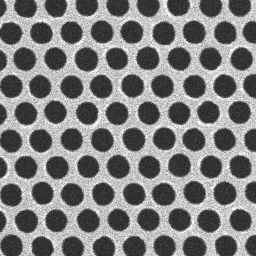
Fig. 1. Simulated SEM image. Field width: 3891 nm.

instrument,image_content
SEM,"a regular array of holes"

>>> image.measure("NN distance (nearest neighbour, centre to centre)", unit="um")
0.452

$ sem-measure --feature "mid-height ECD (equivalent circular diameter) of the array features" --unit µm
0.358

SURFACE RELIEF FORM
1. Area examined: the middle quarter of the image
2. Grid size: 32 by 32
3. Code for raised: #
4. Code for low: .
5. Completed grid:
###.....###.....###....####....#
####...######.######..######..##
################..##############
....###....####....###.....####.
.....##.....##......##.....###..
.....#......##......#.......##..
.....##.....##......##......##..
.....##.....###.....##.....###..
#..#####...#####..######..######
#####.######..######..######..##
####....###....####....###.....#
.##.....##......##......##......
.##......#......##......##......
###......##.....###.....##......
####....###....#####...####....#
################################
....####...####....####....####.
.....##.....###.....##......##..
.....##.....##.......#......#...
.....##.....###.....##......#...
....###.....###.....###.....##..
#...####...#####...#####..#####.
############################..##
####....####...####....###.....#
.##......##.....###.....##......
.##......##.....##......##......
.##......##.....###.....##......
.###....###.....###.....###....#
#####..######..#####...#########
###############################.
....####....###.....###....###..
.....##.....###.....##......##..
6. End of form